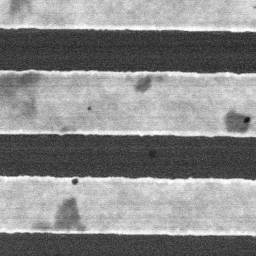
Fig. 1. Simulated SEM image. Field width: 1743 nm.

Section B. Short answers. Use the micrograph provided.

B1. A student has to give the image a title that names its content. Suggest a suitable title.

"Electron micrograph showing lines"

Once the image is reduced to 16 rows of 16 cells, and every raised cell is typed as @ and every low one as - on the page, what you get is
@@@@@@@@@@@@@@@@
@@@@@@@@@@@@@@@@
----------------
----------------
@@@-@@----------
@@@@@@@@@@@@@@@@
@@@@@@@@@@@@@@@@
@@@@@@@@@@@@@@@@
--------------@-
----------------
----------------
@@@@@@@@@@@@@@@@
@@@@@@@@@@@@@@@@
@@@@@@@@@@@@@@@@
---@@@@@@@@@@@@@
----------------